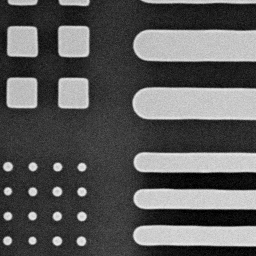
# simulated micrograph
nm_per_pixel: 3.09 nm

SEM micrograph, groups of lines, slits or small figures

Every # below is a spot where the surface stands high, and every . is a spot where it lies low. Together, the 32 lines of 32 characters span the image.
.###....###.....................
................................
................................
.###....###.....................
.####..####......###############
.####..####......###############
.####..####......###############
..................##############
................................
................................
.####..####.....................
.####..####......###############
.####..####......###############
.................###############
.................###############
................................
................................
................................
................................
.................###############
.................###############
....................##..###.....
................................
................................
.................###############
.................###############
................................
................................
.................###############
.................###############
.................###############
................................